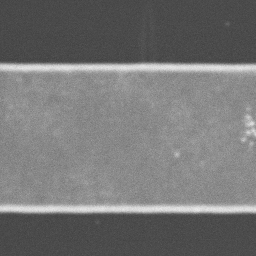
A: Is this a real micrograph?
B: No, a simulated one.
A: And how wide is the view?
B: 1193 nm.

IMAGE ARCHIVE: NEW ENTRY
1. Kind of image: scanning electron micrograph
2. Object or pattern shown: wiring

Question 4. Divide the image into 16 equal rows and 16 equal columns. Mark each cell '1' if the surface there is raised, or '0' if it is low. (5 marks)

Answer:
0000000000000000
0000000000000000
0000000000000000
0000000000000000
1111111111111111
1111111111111111
1111111111111111
1111111111111111
1111111111111111
1111111111111111
1111111111111111
1111111111111111
1111111111111111
0000000000000000
0000000000000000
0000000000000000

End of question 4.